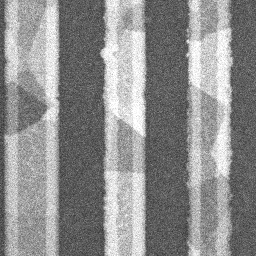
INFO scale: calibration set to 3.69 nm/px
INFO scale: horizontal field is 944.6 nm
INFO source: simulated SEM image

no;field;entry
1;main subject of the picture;one or a few lines or trenches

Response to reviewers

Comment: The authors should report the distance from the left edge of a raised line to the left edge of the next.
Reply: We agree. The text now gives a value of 326 nanometers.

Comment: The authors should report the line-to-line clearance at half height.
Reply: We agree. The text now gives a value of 219 nm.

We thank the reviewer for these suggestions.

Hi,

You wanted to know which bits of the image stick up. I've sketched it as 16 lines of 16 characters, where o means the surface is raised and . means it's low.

.oo....oo...oo..
.oo....oo...oo..
.oo....oo...oo..
.oo....oo...oo..
.oo....oo...oo..
.oo....oo...oo..
.oo....oo...oo..
.oo....oo...oo..
.oo....oo...oo..
.oo....oo...oo..
.oo....oo...oo..
.oo....oo...oo..
.oo....oo...oo..
.oo....oo...oo..
.oo....oo...oo..
.oo....oo...oo..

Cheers